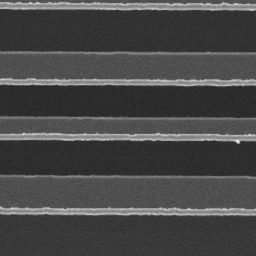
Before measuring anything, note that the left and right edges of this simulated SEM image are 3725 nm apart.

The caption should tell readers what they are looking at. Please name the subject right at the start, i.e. lines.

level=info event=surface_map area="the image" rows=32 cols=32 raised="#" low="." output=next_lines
################################
................................
................................
................................
................................
................................
................................
################################
################################
################################
################################
................................
................................
................................
................................
################################
################################
........########################
................................
................................
................................
................................
################################
################################
################################
################################
################################
................................
................................
................................
................................
................................